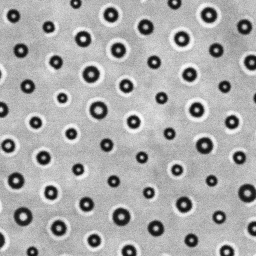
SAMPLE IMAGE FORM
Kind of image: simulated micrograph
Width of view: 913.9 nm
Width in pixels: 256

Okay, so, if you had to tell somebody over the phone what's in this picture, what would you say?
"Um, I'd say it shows a regular array of ring-shaped grooves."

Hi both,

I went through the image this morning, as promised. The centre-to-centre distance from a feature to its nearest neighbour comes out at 0.128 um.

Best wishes